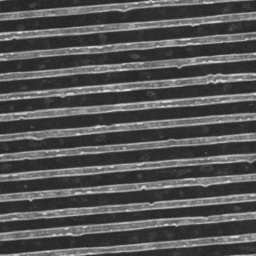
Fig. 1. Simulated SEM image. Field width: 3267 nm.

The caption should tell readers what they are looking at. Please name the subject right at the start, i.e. parallel lines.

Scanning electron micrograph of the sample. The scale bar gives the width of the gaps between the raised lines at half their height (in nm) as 167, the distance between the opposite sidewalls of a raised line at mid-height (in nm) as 93.8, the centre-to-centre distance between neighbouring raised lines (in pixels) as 20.